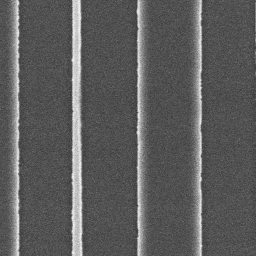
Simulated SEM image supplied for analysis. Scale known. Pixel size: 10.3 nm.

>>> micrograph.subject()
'lines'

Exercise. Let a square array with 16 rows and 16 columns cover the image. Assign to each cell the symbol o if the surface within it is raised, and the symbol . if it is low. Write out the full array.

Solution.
o........oooo...
o........oooo...
o........oooo...
o........oooo...
o........oooo...
o........oooo...
o........oooo...
o........oooo...
o........oooo...
o........oooo...
o........oooo...
o........oooo...
o........oooo...
o........oooo...
o........oooo...
o........oooo...